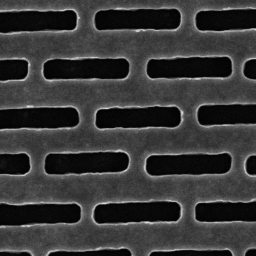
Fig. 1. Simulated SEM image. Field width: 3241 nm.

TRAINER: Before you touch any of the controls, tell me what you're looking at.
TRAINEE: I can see holes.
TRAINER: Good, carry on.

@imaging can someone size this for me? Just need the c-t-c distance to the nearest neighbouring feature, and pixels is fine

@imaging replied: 70.3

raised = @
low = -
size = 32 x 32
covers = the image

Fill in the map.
@@@@@@@@@@@@@@@@@@@@@@@@@@@@@@@@
---------@@@----------@@@-------
----------@@-----------@--------
---------@@@----------@@@-------
@@@@@@@@@@@@@@@@@@@@@@@@@@@@@@@@
@@@@@@@@@@@@@@@@@@@@@@@@@@@@@@@@
@@@@@@@@@@@@@@@@@@@@@@@@@@@@@@@@
---@@@----------@@@----------@@-
----@-----------@@-----------@@-
---@@@----------@@@----------@@-
@@@@@@@@@@@@@@@@@@@@@@@@@@@@@@@@
@@@@@@@@@@@@@@@@@@@@@@@@@@@@@@@@
@@@@@@@@@@@@@@@@@@@@@@@@@@@@@@@@
@@@@-----@@@@@@@@-----@@@-------
----------@@-----------@@-------
----------@@----------@@@-------
@@@@@@@@@@@@@@@@@@@@@@@@@@@@@@@@
@@@@@@@@@@@@@@@@@@@@@@@@@@@@@@@@
@@@@@@@@@@@@@@@@@@@@@@@@@@@@@@@@
---@@@----------@@@----------@@-
----@@----------@@-----------@@-
---@@@---------@@@----------@@@-
@@@@@@@@@@@@@@@@@@@@@@@@@@@@@@@@
@@@@@@@@@@@@@@@@@@@@@@@@@@@@@@@@
@@@@@@@@@@@@@@@@@@@@@@@@@@@@@@@@
-@@@@--@@@@@@---------@@@-------
----------@@-----------@--------
----------@@----------@@@-------
@@@@@@@@@@@@@@@@@@@@@@@@@@@@@@@@
@@@@@@@@@@@@@@@@@@@@@@@@@@@@@@@@
@@@@@@@@@@@@@@@@@@@@@@@@@@@@@@@@
---@@@@---------@@@----------@@-